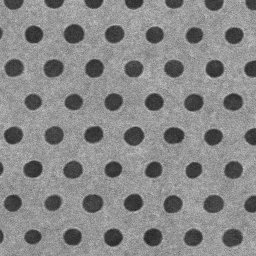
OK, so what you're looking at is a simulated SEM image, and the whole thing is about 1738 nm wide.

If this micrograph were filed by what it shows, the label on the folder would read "a regular array of holes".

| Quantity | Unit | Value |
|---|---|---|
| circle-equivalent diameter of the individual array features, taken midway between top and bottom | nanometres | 129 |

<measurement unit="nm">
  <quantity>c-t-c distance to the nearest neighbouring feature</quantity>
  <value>263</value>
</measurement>